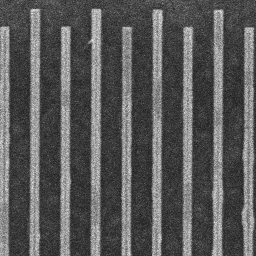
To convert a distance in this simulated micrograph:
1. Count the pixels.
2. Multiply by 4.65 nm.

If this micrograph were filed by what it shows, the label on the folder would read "parallel lines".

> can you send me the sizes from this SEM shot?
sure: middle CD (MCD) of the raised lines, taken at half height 37.2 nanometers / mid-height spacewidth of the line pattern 0.106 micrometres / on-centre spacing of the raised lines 0.142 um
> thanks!